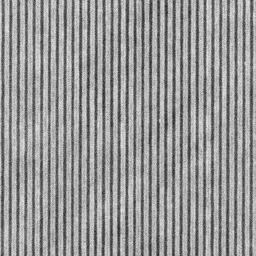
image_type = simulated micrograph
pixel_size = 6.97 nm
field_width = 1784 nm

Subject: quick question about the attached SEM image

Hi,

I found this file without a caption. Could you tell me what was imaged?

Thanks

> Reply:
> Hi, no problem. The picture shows parallel lines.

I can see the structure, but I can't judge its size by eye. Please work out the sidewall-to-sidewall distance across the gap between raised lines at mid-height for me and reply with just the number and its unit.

0.0261 microns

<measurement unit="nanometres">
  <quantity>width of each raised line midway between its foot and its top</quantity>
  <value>29.6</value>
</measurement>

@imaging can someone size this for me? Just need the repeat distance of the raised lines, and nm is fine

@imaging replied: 54.1